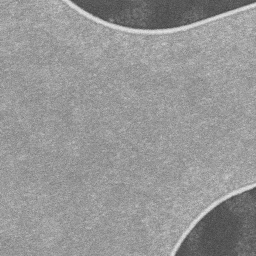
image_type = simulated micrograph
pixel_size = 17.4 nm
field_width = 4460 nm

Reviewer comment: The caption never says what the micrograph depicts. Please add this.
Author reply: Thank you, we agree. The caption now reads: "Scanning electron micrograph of one or a few lines or trenches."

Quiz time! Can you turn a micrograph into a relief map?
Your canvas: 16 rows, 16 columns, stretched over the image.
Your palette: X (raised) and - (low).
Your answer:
XXXXX----------X
XXXXXXX-----XXXX
XXXXXXXXXXXXXXXX
XXXXXXXXXXXXXXXX
XXXXXXXXXXXXXXXX
XXXXXXXXXXXXXXXX
XXXXXXXXXXXXXXXX
XXXXXXXXXXXXXXXX
XXXXXXXXXXXXXXXX
XXXXXXXXXXXXXXXX
XXXXXXXXXXXXXXXX
XXXXXXXXXXXXXXXX
XXXXXXXXXXXXXX--
XXXXXXXXXXXXX---
XXXXXXXXXXXX----
XXXXXXXXXXX-----